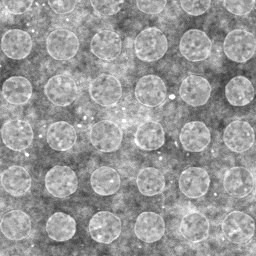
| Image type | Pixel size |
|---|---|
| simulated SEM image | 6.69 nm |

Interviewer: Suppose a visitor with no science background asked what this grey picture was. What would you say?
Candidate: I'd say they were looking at a regular array of raised bodies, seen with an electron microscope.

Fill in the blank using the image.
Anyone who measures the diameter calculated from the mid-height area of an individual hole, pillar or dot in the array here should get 204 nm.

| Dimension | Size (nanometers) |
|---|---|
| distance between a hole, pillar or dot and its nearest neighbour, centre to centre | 296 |